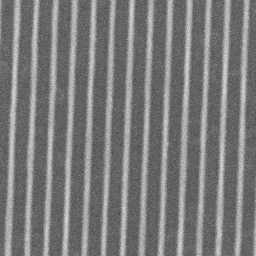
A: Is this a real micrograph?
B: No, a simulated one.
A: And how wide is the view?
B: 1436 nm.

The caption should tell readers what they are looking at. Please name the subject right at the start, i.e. parallel lines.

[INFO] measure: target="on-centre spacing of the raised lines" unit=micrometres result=0.107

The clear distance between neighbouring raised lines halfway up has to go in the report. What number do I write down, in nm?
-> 85.5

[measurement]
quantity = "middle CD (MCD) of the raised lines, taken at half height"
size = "3.87 pixels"